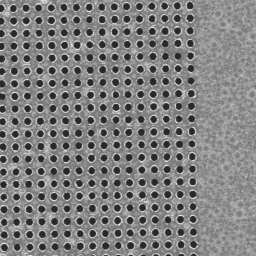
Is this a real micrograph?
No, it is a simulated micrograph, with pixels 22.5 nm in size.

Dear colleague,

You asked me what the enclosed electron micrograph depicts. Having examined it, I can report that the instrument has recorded a regular array of holes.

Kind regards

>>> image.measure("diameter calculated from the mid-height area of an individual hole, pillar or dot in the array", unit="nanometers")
162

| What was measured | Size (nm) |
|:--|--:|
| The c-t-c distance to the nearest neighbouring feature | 277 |